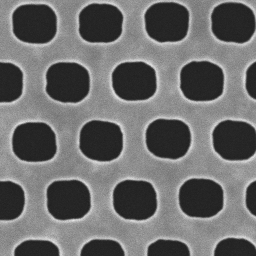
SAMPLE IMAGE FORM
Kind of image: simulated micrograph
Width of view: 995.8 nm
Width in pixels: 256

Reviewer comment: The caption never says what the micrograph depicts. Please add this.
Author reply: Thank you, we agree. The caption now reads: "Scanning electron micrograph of a regular array of holes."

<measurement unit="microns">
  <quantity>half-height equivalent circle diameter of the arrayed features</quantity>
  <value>0.172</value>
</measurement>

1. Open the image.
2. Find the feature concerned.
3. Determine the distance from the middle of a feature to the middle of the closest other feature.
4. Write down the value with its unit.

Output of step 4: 0.259 microns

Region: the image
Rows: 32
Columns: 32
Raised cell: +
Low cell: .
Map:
++++.++++++...+++++...++++++..++
++.....+++.....+++......+++.....
+......+++.....+++......++......
++.....+++.....+++......++......
++.....+++.....++++....++++....+
++++.+++++++++++++++++++++++++++
++++++++++++++++++++++++++++++++
++++++++++++++++++++++++++++++++
..++++.....+++.....++++.....+++.
...+++.....+++.....+++......+++.
...+++.....+++......+++.....+++.
...+++.....+++.....++++.....+++.
..+++++...++++++..++++++...+++++
++++++++++++++++++++++++++++++++
++++++++++++++++++++++++++++++++
+++...+++++....++++....++++....+
++.....+++.....+++......+++.....
+......+++.....+++......+++.....
++.....+++.....+++......+++.....
++.....++++....++++....++++.....
++++++++++++++++++++++++++++++++
++++++++++++++++++++++++++++++++
+++++++++.++++++.++++++...++++++
...+++.....+++.....++++.....+++.
...+++.....+++......++......+++.
...+++.....+++......++......+++.
...+++.....++++....++++....++++.
.+++++++++++++++..++++++++++++++
++++++++++++++++++++++++++++++++
++++++++++++++++++++++++++++++++
++.....++++....++++....++++.....
++.....+++......++......+++.....